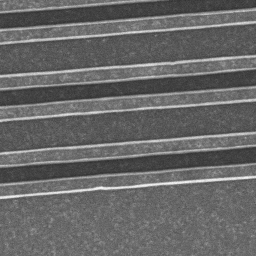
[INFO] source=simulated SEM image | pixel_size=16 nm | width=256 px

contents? parallel lines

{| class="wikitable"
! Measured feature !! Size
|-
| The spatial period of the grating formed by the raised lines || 614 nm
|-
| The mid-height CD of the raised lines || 225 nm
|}